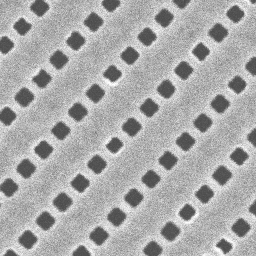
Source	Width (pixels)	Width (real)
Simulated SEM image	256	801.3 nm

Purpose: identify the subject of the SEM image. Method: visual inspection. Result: a regular array of holes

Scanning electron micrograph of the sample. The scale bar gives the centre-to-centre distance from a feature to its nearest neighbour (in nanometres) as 79.5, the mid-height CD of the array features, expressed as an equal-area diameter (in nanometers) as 54.3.